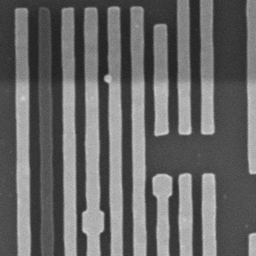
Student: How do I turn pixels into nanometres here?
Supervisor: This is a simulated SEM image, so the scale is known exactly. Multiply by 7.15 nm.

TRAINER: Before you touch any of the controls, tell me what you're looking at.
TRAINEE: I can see wiring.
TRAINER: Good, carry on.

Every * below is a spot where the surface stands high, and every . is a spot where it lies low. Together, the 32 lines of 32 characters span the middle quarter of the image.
***..***...***...***...***...**.
***..***...***...***...***...**.
***..***...***...***...***...**.
***..***..****...***...***...**.
***...**...***...***...***...**.
***...**...***...***...***...**.
***...**...***...***...***...**.
***...**...***...***...***...**.
***...***..***...***...***...**.
***...***..***...***...***...**.
***...***..***...***...***...**.
***...***..***...***...***...**.
***...***..***...***...***...**.
***...***..***...***...***...**.
***...***..***...***...***...**.
***...***..***...***...***...***
***...***..***...***...***...***
***...***...**...***...**.......
***...***...**...***............
***..****...**...***............
***..****...**...***............
***...***...**...***............
***...***...**...***............
***...***...**...***............
***...***...**...***............
***...***...**...***............
***...***...**...***............
***...***...**...***............
***...***...**...***..*****..***
***...***...**....**..*****..***
***...***...**....**..*****..***
***...***...**....**..*****..***